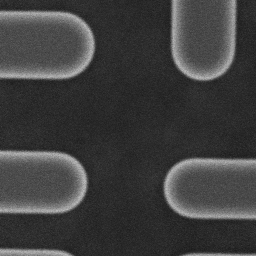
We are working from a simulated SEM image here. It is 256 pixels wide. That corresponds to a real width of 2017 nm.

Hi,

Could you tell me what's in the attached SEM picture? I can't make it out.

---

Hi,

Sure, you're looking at groups of lines, slits or small figures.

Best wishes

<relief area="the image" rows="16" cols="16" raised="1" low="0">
0000000000011110
1111100000011110
1111110000011110
1111110000011110
1111100000011100
0000000000000000
0000000000000000
0000000000000000
0000000000000000
1000000000000000
1111100000011111
1111100000111111
1111100000111111
0000000000001111
0000000000000000
0000000000000000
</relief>